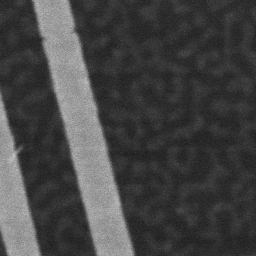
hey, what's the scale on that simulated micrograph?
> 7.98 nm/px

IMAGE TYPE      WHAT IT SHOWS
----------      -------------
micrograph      one or a few lines or trenches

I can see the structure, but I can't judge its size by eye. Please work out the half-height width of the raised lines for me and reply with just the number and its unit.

0.272 microns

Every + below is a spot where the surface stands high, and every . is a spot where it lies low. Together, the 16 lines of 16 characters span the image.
..++............
..+++...........
...++...........
...++...........
...++...........
...+++..........
....++..........
....++..........
+...++..........
+...+++.........
+....++.........
+....++.........
++...++.........
++...+++........
++....++........
++....++........